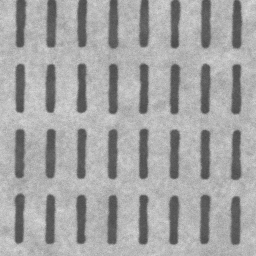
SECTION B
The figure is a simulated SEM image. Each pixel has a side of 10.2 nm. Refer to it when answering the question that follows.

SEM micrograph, a regular array of holes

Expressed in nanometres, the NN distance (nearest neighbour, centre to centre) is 312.